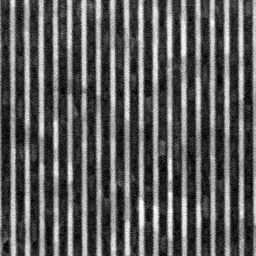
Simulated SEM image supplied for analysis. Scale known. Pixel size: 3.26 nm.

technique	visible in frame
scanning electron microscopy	parallel lines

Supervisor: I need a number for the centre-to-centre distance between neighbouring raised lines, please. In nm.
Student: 46.5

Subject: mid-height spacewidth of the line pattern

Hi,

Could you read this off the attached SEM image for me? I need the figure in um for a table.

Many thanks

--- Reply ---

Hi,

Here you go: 0.0342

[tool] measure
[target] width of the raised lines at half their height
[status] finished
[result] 11.4 nanometres